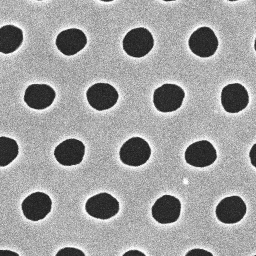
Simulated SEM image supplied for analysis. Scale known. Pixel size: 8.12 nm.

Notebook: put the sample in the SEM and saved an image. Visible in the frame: a regular array of holes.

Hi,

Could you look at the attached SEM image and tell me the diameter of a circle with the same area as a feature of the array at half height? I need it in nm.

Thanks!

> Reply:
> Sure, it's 242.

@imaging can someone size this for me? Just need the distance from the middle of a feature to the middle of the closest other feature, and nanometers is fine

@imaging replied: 514